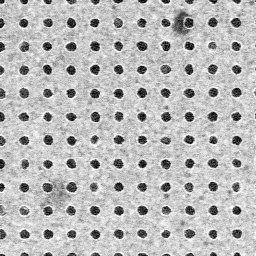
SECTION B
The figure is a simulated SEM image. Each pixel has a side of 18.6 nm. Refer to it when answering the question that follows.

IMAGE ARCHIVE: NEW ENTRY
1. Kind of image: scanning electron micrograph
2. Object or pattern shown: a regular array of holes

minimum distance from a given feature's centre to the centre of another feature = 430 nm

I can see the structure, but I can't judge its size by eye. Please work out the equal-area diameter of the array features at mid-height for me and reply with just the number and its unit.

194 nanometres